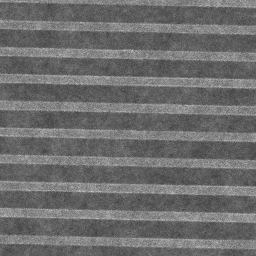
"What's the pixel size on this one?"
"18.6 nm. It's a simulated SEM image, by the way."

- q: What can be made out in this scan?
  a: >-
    parallel lines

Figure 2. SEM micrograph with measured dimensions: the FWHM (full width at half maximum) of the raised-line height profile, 148 nanometers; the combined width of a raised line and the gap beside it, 498 nanometres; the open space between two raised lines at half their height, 350 nm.